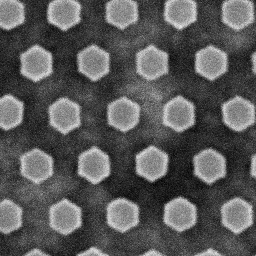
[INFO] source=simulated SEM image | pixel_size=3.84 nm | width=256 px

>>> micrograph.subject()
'a regular array of raised bodies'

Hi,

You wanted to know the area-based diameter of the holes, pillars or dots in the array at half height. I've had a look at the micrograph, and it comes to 31.7 pixels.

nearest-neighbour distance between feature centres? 219 nanometres